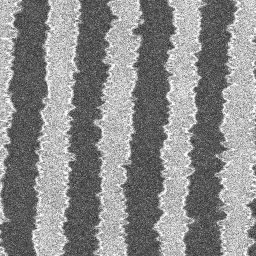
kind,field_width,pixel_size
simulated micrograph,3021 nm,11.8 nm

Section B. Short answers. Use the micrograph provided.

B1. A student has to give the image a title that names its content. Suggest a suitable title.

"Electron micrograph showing one or a few lines or trenches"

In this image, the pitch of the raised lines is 720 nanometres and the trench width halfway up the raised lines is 292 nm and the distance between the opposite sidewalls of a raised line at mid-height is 0.425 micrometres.